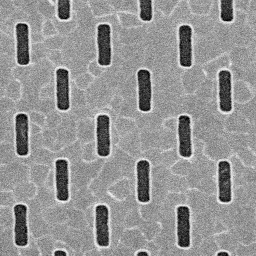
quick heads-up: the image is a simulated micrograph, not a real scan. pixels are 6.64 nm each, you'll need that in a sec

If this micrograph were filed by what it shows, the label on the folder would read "a regular array of holes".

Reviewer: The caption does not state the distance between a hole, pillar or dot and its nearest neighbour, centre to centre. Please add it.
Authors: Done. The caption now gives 401 nm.